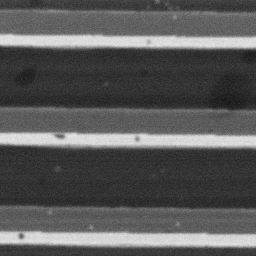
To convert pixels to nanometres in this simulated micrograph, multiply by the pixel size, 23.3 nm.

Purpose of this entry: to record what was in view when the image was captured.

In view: lines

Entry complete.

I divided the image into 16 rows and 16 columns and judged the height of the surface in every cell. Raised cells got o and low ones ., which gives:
................
oooooooooooooooo
oooooooooooooooo
................
................
................
................
oooooooooooooooo
oooooooooooooooo
................
................
................
................
oooooooooooooooo
oooooooooooooooo
................